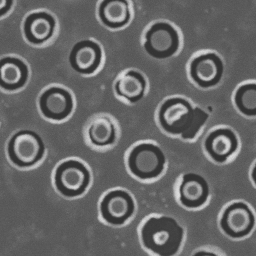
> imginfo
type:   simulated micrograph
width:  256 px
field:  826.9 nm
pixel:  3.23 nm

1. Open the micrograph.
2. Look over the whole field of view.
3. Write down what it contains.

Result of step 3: a regular array of ring-shaped grooves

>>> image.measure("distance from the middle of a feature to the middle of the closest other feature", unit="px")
53.9